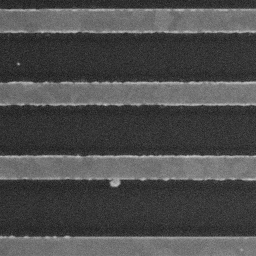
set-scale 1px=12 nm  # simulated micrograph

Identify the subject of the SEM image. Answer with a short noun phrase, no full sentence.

lines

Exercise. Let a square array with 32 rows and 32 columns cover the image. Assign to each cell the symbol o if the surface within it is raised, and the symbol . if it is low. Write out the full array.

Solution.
................................
oooooooooooooooooooooooooooooooo
oooooooooooooooooooooooooooooooo
oooooooooooooooooooooooooooooooo
................................
................................
................................
................................
................................
................................
oooooooooooooooooooooooooooooooo
oooooooooooooooooooooooooooooooo
oooooooooooooooooooooooooooooooo
................................
................................
................................
................................
................................
................................
................................
oooooooooooooooooooooooooooooooo
oooooooooooooooooooooooooooooooo
..............o.................
................................
................................
................................
................................
................................
................................
................................
oooooooooooooooooooooooooooooooo
oooooooooooooooooooooooooooooooo